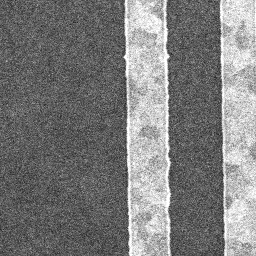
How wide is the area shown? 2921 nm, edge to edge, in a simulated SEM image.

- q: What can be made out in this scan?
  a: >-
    one or a few lines or trenches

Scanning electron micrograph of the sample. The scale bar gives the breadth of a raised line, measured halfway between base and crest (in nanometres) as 439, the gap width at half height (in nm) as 643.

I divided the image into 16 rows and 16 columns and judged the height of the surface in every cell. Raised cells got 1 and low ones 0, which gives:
0000000011000011
0000000011000011
0000000011000011
0000000011000011
0000000011000011
0000000011000011
0000000011000011
0000000011000011
0000000011000011
0000000011000011
0000000011000011
0000000011000011
0000000011100011
0000000011000011
0000000011100011
0000000011100011